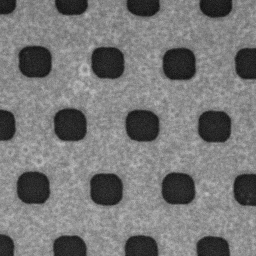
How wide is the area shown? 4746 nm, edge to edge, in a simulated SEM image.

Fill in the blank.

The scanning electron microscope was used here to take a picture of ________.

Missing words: a regular array of holes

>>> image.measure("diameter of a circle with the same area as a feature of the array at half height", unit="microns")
0.652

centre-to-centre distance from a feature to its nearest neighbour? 1.33 µm